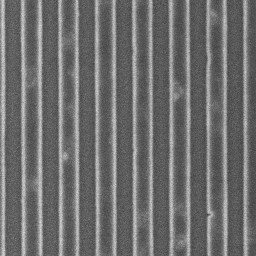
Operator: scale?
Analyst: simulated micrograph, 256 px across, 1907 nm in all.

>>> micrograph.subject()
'parallel lines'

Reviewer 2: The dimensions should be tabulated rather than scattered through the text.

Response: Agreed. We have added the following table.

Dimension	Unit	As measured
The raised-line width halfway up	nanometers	133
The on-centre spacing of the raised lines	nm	276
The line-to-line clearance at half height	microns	0.142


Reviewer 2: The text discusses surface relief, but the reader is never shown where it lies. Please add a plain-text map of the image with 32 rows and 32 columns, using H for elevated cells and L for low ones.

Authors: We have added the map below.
LLLHHLLHHHLLHHLLLHHLLHHHLLHHLLLH
LLLHHLLHHHLLHHLLLHHLLHHHLLHHLLLH
LLLHHLLHHHLLHHLLLHHLLHHHLLHHLLLH
LLLHHLLHHHLLHHLLLHHLLHHHLLHHLLLH
LLLHHLLHHHLLHHLLLHHLLHHHLLHHLLLH
LLLHHLLLHHLLHHLLLHHLLHHHLLHHLLLH
LLLHHLLHHHLLHHLLLHHLLHHHLLHHLLLH
LLLHHLLHHHLLHHLLLHHLLHHHLLHHLLLH
LLLHHLLLHHLLHHLLLHHLLHHHLLHHLLLH
LLLHHLLLHHLLHHLLLHHLLHHHLLHHLLLH
LLLHHLLLHHLLHHLLLHHLLHHHLLHHLLLH
LLLHHLLHHHLLHHLLLHHLLHHHLLHHLLLH
LLLHHLLHHHLLHHLLLHHLLHHHLLHHLLLH
LLLHHLLLHHLLHHLLLHHLLHHHLLHHLLLH
LLLHHLLLHHLLHHLLLHHLLHHHLLHHLLLH
LLLHHLLLHHLLHHLLLHHLLHHHLLHHLLLH
LLLHHLLLHHLLHHLLLHHLLHHHLLHHLLLH
LLLHHLLLHHLLHHLLLHHLLHHHLLHHLLLH
LLLHHLLLHHLLHHLLLHHLLHHHLLHHLLLH
LLLHHLLLHHLLHHLLLHHLLHHHLLHHLLLH
LLLHHLLLHHLLHHLLLHHLLHHHLLHHLLLH
LLLHHLLLHHLLHHLLLHHLLHHHLLHHLLLH
LLLHHLLLHHLLHHLLLHHLLHHHLLHHLLLH
LLLHHLLLHHLLHHLLLHHLLHHLLLHHLLLH
LLLHHLLLHHLLHHLLLHHLLHHHLLHHLLLH
LLLHHLLLHHLLHHLLLHHLLHHHLLHHLLLH
LLLHHLLLHHLLHHLLLHHLLHHHLLHHLLLH
LLLHHLLLHHLLHHLLLHHLLHHHLLHHLLLH
LLLHHLLLHHLLHHLLLHHLLHHHLLHHLLLH
LLLHHLLLHHLLHHLLLHHLLHHHLLHHLLLH
LLLHHLLLHHLLHHLLLHHLLHHHLLHHLLLH
LLLHHLLLHHLLHHLLLHHLLHHHLLHHLLLH